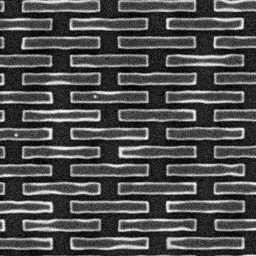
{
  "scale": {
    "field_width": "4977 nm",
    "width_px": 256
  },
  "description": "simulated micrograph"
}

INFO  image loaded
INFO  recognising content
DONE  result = groups of lines, slits or small figures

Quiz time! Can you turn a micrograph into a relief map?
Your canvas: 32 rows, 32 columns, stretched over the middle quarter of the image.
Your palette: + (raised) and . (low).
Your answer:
.......+++.++...................
................................
+.+++.+++.....+++++..+++++++++++
+++++++++.....++++++++++++++++++
+++++++++.....++++++++++++++++++
................................
................................
..+++++++++++++++++++.....++++++
..+++++++++++++++++++.....++++++
..+++++++++++++++++++.....+++...
................................
................................
+++++++++.....++++++++++++++++++
+++++++++.....++++++++++++++++++
................................
................................
..+++++..++++++++++++.....++++++
..+++++++++++++++++++.....++++++
..++++++.+++++....+++.....++++++
................................
................................
+++++++++.....++++++++++++++++++
+++++++++.....++++++++++++++++++
................................
................................
..+++++++++++++++++++.....++++++
..+++++++++++++++++++.....++++++
..+++++++++++++++++++.....++++++
................................
................................
+++++++++.....++++++++++++++++++
+++++++++.....++++++++++++++++++